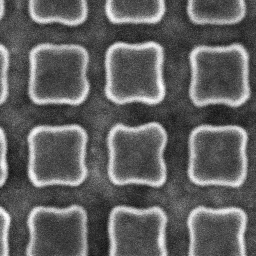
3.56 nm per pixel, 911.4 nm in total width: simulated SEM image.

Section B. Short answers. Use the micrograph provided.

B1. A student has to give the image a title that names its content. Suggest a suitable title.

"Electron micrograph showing raised bodies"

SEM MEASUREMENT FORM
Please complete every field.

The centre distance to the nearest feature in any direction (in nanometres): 284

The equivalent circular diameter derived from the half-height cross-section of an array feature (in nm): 224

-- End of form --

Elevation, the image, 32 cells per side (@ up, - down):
----@@@@@@@--@@@@@@@----@@@@@@--
----@@@@@@@--@@@@@@@----@@@@@@--
-----@@@@@----@@@@@@----@@@@@@--
--------------------------------
--------------------------------
--------------------------------
@---@@@@@@@---@@@@@@----@@@@@@@-
@---@@@@@@@--@@@@@@@----@@@@@@@-
@---@@@@@@@--@@@@@@@----@@@@@@@-
@---@@@@@@@--@@@@@@@----@@@@@@@-
@---@@@@@@@--@@@@@@@----@@@@@@@-
@---@@@@@@@--@@@@@@@----@@@@@@@-
----@@@@@@----@@@@@@----@@@@@@@-
--------------------------------
--------------------------------
-------------------@------------
----@@@@@@----@@@@@@@---@@@@@@@-
@---@@@@@@@---@@@@@@@---@@@@@@@-
@---@@@@@@@---@@@@@@----@@@@@@@-
@---@@@@@@----@@@@@@----@@@@@@@-
@---@@@@@@----@@@@@@----@@@@@@@-
@---@@@@@@@---@@@@@@@---@@@@@@@-
@---@@@@@@----@@@@@@----@@@@@@--
--------------------------------
--------------------------------
--------------------------------
@---@@@@@@----@@@@@@----@@@@@@--
@---@@@@@@@---@@@@@@@---@@@@@@@-
@---@@@@@@@---@@@@@@----@@@@@@@-
@---@@@@@@@---@@@@@@----@@@@@@--
@---@@@@@@@---@@@@@@@---@@@@@@--
@--@@@@@@@@---@@@@@@@---@@@@@@@-